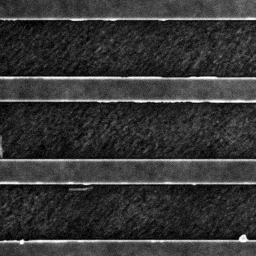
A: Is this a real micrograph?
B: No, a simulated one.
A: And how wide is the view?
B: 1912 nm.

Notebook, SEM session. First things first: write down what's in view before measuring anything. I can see lines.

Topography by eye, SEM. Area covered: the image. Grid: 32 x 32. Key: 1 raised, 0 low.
11111111111111111111111111111111
11111111111111111111111111111111
00000000111001100000100000000000
00000000000000000000000000000000
00000000000000000000000000000000
00000000000000000000000000000000
00000000000000000000000000000000
00000000000000000000000000000000
00000000000000000000000000000000
00000000000000000000000000000000
11111111111111111111111111111111
11111111111111111111111111111111
11111111111111111111111111111111
00000000000000000000000000000000
00000000000000000000000000000000
00000000000000000000000000000000
00000000000000000000000000000000
00000000000000000000000000000000
00000000000000000000000000000000
00000000000000000000000000000000
11111111111111111111111111111111
11111111111111111111111111111111
11111111111111111111111111111111
00000000000000000000000000000000
00000000000000000000000000000000
00000000000000000000000000000000
00000000000000000000000000000000
00000000000000000000000000000000
00000000000000000000000000000000
00000000000000000000000000000000
11111111111111111111111111111111
11111111111111111111111111111111